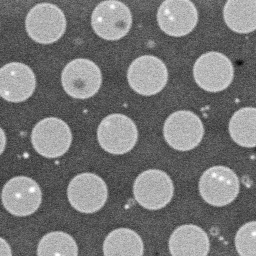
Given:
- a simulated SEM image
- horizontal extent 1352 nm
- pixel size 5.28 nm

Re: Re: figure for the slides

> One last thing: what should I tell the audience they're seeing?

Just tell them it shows an array of small figures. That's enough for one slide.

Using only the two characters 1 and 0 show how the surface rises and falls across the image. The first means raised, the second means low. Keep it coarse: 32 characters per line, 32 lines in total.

00000000000001100000111100001111
00001111000011110000111100001111
00011111000011110000111110001111
00011111000011110000111100000111
00001111000001100000000000000000
00000000000000000000000000000000
00000000000000000000000000000000
00000000011000000111000001110000
11110000111100001111100011111000
11110000111110001111100011111000
11110000111100001111100001111000
11110000111100000111000000000000
01100000000000000000000000000000
00000000000000000000000000000000
00000000000000100000011100000111
00000111000001111000011110000111
00001111100011111000111110000111
10001111100011111000011110000111
00001111000001110000001100000000
00000010000000000000000000000000
00000000000000000000000000000000
00000000000000000011000000111000
01110000011110000111100001111100
11111000011110000111100001111100
11111000011110000111100001111000
11111000011110000011100000110000
01110000000000000000000000000000
00000000000000000000000000000000
00000000000000000000001110000011
00000011100000111000011111000011
10000111100001111100011111000011
10000111110001111100011111000011